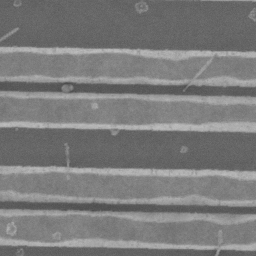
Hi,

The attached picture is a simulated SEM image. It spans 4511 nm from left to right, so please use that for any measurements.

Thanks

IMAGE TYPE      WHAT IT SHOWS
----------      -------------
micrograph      lines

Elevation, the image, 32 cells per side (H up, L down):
LLLLLLLLLLLLLLLLLLLLLLLLLLLLLLLL
LLLLLLLLLLLLLLLLLLLLLLLLLLLLLLLL
LLLLLLLLLLLLLLLLLLLLLLLLLLLLLLLL
LLLLLLLLLLLLLLLLLLLLLLLLLLLLLLLL
LLLLLLLLLLLLLLLLLLLLLLLLLLLLLLLL
LLLLLLLLLLLLLLLLLLLLLLLLLLLLLLLL
HHHHHHHHHHHHHHHHHHLLLLLLLLLLLLLL
HHHHHHHHHHHHHHHHHHHHHHHHHHHHHHHH
HHHHHHHHHHHHHHHHHHHHHHHHHHHHHHHH
HHHHHHHHHHHHHHHHHHHHHHHHHHHHHHHH
LLLLLLLLLLLLLLLLLLLLLLLLLLLLLLLL
LLLLLLLLLLLLLLLLLLLLLLLLLLLLLLLL
HHHHHHHHHHHHHHHHHHHHHHHHHHLLLLLL
HHHHHHHHHHHHHHHHHHHHHHHHHHHHHHHH
HHHHHHHHHHHHHHHHHHHHHHHHHHHHHHHH
HHHHHHHHHHHHHHHHHHHHHHHHHHHHHHHH
LLLLLLLLLLLLLLLLLLLLLLLLLLLLLLLL
LLLLLLLLLLLLLLLLLLLLLLLLLLLLLLLL
LLLLLLLLLLLLLLLLLLLLLLLLLLLLLLLL
LLLLLLLLLLLLLLLLLLLLLLLLLLLLLLLL
LLLLLLLLLLLLLLLLLLLLLLLLLLLLLLLL
HHHHHHHHHHHHHHHHHLLLLLLLLLLLLLLL
HHHHHHHHHHHHHHHHHHHHHHHHHHHHHHHH
HHHHHHHHHHHHHHHHHHHHHHHHHHHHHHHH
HHHHHHHHHHHHHHHHHHHHHHHHHHHHHHHH
LLLLLLLLLLLLLLLLLLLLLLLLLLLLLLLL
LLLLLLLLLLLLLLLLLLLLLLLLLLLLLLLL
HHHHHHHHHHHHHHHHHHHHHHHHHHHHHHHH
HHHHHHHHHHHHHHHHHHHHHHHHHHHHHHHH
HHHHHHHHHHHHHHHHHHHHHHHHHHHHHHHH
LLLLHHHHHLLLLHHHHHHHHHHHHHHHHHHH
LLLLLLLLLLLLLLLLLLLLLLLLLLLLLLLL